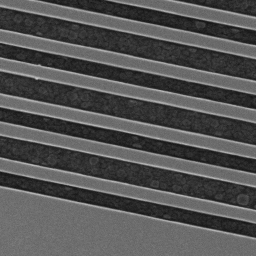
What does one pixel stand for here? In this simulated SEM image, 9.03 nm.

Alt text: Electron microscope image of parallel lines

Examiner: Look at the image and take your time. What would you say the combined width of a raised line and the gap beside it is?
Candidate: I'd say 288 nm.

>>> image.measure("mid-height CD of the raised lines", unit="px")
13.5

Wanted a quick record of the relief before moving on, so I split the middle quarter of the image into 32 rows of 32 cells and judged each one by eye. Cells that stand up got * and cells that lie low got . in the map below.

.............****************...
..................**************
****..................**********
*********..................*****
**************..................
..*****************.............
.......*****************........
............*****************...
.................***************
.......................*********
...........................*****
*****...........................
*********.......................
**************..................
...***************..............
........****************........
.............****************...
..................**************
****..................**********
*********..................*****
**************..................
...****************.............
.......*****************........
............*****************...
.................***************
......................**********
...........................*****
***.............................
********........................
*************...................
..****************..............
.......****************.........